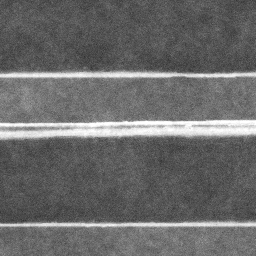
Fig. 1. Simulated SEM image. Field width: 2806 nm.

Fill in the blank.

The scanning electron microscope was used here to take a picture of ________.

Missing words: lines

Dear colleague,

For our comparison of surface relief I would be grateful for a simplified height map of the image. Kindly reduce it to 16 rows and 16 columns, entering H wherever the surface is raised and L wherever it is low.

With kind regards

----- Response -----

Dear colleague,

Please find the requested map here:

LLLLLLLLLLLLLLLL
LLLLLLLLLLLLLLLL
LLLLLLLLLLLLLLLL
LLLLLLLLLLLLLLLL
LLLLLLLLLLLLLLLL
HHHHHHHHHHHHHHHH
HHHHHHHHHHHHHHHH
HHHHHHHHHHHHHHHH
LLLLLLLLLLLLLLLL
LLLLLLLLLLLLLLLL
LLLLLLLLLLLLLLLL
LLLLLLLLLLLLLLLL
LLLLLLLLLLLLLLLL
LLLLLLLLLLLLLLLL
HHHHHHHHHHHHHHHH
HHHHHHHHHHHHHHHH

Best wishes